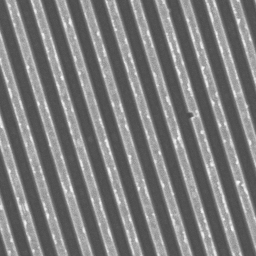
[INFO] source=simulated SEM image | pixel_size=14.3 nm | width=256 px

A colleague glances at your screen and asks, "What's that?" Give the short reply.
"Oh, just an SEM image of parallel lines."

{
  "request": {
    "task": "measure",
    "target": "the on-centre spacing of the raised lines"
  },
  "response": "340 nanometers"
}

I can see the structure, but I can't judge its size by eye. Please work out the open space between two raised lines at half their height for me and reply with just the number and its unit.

181 nanometers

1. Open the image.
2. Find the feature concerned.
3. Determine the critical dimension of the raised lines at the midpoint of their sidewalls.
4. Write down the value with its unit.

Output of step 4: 157 nm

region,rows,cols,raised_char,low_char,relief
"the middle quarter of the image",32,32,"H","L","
LLLHHHLLLHHHLLLHHHLLLHHHLLLLHHLL
LLLHHHLLLHHHLLLHHHLLLLHHLLLLHHHL
LLLHHHLLLLHHLLLLHHHLLLHHHLLLHHHL
LLLLHHLLLLHHHLLLHHHLLLHHHLLLHHHL
HLLLHHHLLLHHHLLLHHHLLLLHHLLLLHHH
HLLLHHHLLLHHHLLLLHHLLLLHHHLLLHHH
HLLLLHHLLLLHHHLLLHHHLLLHHHLLLHHH
HHLLLHHHLLLHHHLLLHHHLLLHHHLLLLHH
HHLLLHHHLLLHHHLLLLHHLLLLHHHLLLHH
HHLLLHHHLLLLHHHLLLHHHLLLHHHLLLHH
HHLLLLHHHLLLHHHLLLHHHLLLHHHLLLLH
HHHLLLHHHLLLHHHLLLHHHLLLLHHHLLLH
HHHLLLHHHLLLLHHLLLLHHHLLLHHHLLLL
HHHLLLLHHHLLLHHHLLLHHHLLLHHHLLLL
LHHHLLLHHHLLLHHHLLLHHHLLLLHHLLLL
LHHHLLLHHHLLLHHHLLLLHHHLLLHHHLLL
LHHHLLLLHHLLLLHHHLLLHHHLLLHHHLLL
LLHHHLLLHHHLLLHHHLLLHHHLLLHHHLLL
LLHHHLLLHHHLLLHHHLLLLHHLLLLHHHLL
LLHHHLLLHHHLLLLHHHLLLHHHLLLHHHLL
LLLHHLLLLHHHLLLHHHLLLHHHLLLHHHLL
LLLHHHLLLHHHLLLHHHLLLHHHLLLLHHHL
LLLHHHLLLHHHLLLLHHLLLLHHHLLLHHHL
LLLHHHLLLLHHHLLLHHHLLLHHHLLLHHHL
LLLLHHHLLLHHHLLLHHHLLLHHHLLLLHHL
HLLLHHHLLLHHHLLLHHHLLLLHHHLLLHHH
HLLLHHHLLLLHHLLLLHHHLLLHHHLLLHHH
HLLLLHHHLLLHHHLLLHHHLLLHHHLLLHHH
HLLLLHHHLLLHHHLLLHHHLLLLHHLLLLHH
HHLLLHHHLLLHHHLLLLHHHLLLHHHLLLHH
HHLLLLHHLLLLHHHLLLHHHLLLHHHLLLHH
HHLLLLHHHLLLHHHLLLHHHLLLLHHLLLLH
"